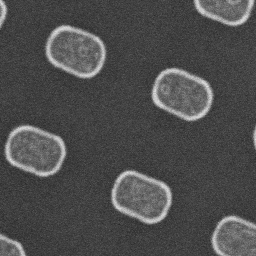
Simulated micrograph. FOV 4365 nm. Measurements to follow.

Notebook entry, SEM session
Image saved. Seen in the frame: raised bodies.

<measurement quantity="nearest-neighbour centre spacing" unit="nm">1860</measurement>